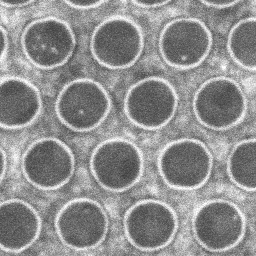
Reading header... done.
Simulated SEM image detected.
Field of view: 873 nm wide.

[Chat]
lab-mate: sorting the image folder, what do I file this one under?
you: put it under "a regular array of raised bodies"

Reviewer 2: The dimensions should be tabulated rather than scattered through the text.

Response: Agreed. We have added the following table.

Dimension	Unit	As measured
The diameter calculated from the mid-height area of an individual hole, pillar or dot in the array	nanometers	173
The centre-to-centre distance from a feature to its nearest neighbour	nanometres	232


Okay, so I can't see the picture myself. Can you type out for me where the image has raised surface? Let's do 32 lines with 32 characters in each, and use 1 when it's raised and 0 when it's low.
11100000011100000111000000111000
00000000000000000000000000000000
00000110000000110000001100000001
00011111100011111000011111000111
10011111100011111100111111000111
10011111100011111100111111000111
10011111100011111100111111000111
00001111000011111000011110000111
00000000000000000000000000000001
00000000000000000000000000000000
11110000011100000111100000111100
11111000111110001111110001111100
11111001111111001111110011111110
11111001111111001111110011111110
11111001111110001111110001111100
11100000111100000111100001111000
00000000000000000000000000000000
00000110000000100000000100000000
00001111000011111000011111000111
10011111100011111100111111000111
10011111100111111100111111000111
00011111100011111100111111000111
00001111000011111000011111000111
00000110000001110000000000000011
00000000000000000000000000000000
11100000011100000111000000111000
11110000111110001111110001111100
11111001111110001111110011111100
11111001111110001111110011111100
11111001111110001111110011111100
11110000111100000111100001111000
00000000000000000000000000000000